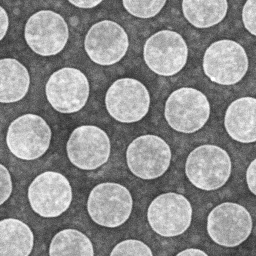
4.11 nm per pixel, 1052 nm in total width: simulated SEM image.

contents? a regular array of raised bodies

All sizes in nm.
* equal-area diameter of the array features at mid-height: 180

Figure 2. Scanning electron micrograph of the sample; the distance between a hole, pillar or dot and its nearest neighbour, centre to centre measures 249 nm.